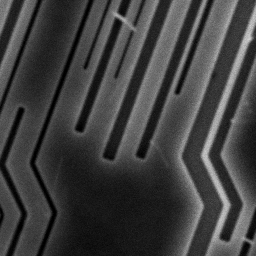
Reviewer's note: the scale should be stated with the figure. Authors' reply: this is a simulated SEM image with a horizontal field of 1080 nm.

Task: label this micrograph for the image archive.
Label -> groups of lines, slits or small figures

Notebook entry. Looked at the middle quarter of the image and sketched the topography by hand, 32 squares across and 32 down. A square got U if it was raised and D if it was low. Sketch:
DDUUUDUUDDDUUUUUUUDDDUUUUUDDDUDD
DUUUUUUUDDDUUDUUUDDDDUUUUDDDUDDU
DUUUUUUDDDUUUDUUUDDDUUUUUDDDUDDU
DUUUUUUDDDUUUUUUUDDDUUUUUDDDUDDU
UUUUUUUDDDUUUUUUDDDDUUUUDDDUDDUU
UUUUUUDDDUUUUUUUDDDUUUUUDDDUDDUU
UUUUUUDDDUUUUUUUDDDUUUUUDDUUDUUU
UUUUUUDDUUUUUUUDDDDUUUUDDDUUDUUU
UUUUUDDDUUUUUUUDDDUUUUUDDDUUUUUU
UUUUUDDDUUUUUUUDDDUUUUUDDUUUUUUU
UUUUUDDUUUUUUUDDDDUUUUDDDUUUUUUU
UUUUDDDUUUUUUUDDDUUUUUDDDUUUUUUU
UUUUDDDUUUUUUDDDDUUUUDDDUUUUUUUU
UUUUDDUUUUUUUDDDUUUUUDDDUUUUUUUU
UUUDDDUUUUUUUDDDUUUUUDDDUUUUUUUU
UUUDDDUUUUUUDDDDUUUUDDDUUUUUUUUU
UUUDDUUUUUUUDDDUUUUUDDDUUUUUUUUU
UUUUUUUUUUUDDDDUUUUUDDDUUUUUUUUD
UUUUUUUUUUUDDDDUUUUDDDUUUUUUUUUD
UUUUUUUUUUUDDDUUUUUDDDUUUUUUUUDD
UUUUUUUUUUDDDDUUUUUDDUUUUUUUUUDD
UUUUUUUUUUDDDDUUUUDDDUUUUUUUUUDD
UUUUUUUUUUDDDUUUUUDDDUUUUUUUUDDD
UUUUUUUUUUDDDUUUUUDDUUUUUUUUUDDD
UUUUUUUUUUUUUUUUUUUUUUUUUUUUUUDD
UUUUUUUUUUUUUUUUUUUUUUUUUUUUUUDD
UUUUUUUUUUUUUUUUUUUUUUUUUUUUUUUD
UUUUUUUUUUUUUUUUUUUUUUUUUUUUUUUD
UUUUUUUUUUUUUUUUUUUUUUUUUUUUUUUU
UUUUUUUUUUUUUUUUUUUUUUUUUUUUUUUU
UUUUUUUUUUUUUUUUUUUUUUUUUUUUUUUU
UUUUUUUUUUUUUUUUUUUUUUUUUUUUUUUU